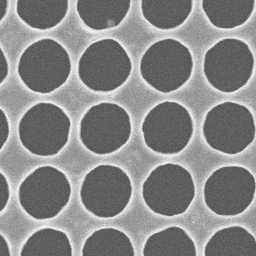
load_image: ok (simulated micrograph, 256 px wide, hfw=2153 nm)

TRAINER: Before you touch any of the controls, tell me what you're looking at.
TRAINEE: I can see a regular array of holes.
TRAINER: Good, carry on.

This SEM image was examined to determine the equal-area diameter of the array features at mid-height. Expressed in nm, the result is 439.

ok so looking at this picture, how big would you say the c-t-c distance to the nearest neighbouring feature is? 61.3 pixels